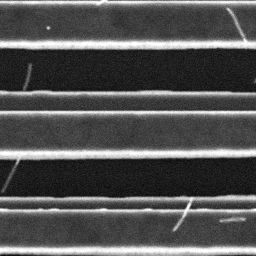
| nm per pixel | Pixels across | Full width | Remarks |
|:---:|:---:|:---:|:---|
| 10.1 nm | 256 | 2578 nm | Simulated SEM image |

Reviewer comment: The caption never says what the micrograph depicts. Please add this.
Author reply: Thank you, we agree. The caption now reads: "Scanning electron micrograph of lines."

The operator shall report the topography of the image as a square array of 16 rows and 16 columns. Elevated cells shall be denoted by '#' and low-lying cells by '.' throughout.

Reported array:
################
################
################
................
................
................
################
################
################
################
................
................
################
################
################
################